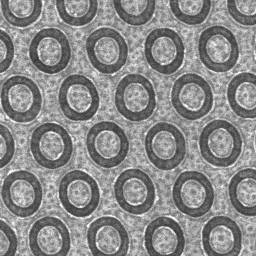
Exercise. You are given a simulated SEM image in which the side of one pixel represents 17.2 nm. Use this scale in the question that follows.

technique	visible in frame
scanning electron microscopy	a regular array of ring-shaped grooves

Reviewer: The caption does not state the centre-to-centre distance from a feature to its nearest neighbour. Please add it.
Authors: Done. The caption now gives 943 nm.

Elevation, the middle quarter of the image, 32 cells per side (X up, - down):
-XXXXXX--------XXXXXX--------XXX
XXXXXXXX------XXXXXXXX------XXXX
XX--XXXXXXX-XXXX---XXXXX---XXX--
------XXXXXXXXX------XXXXXXX----
-------XXXXXXX--------XXXXXX----
--XXX---XXXXX---XXXX--XXXXX---XX
-XXXXX--XXXXX--XXXXXX-XXXXX--XXX
-XXXXX---XXXX--XXXXXX--XXXX--XXX
-XXXXXX--XXXX--XXXXXX--XXXX--XXX
-XXXXXX--XXXX--XXXXXX--XXXX--XXX
--XXXX---XXXX---XXXXX--XXXX---XX
---XXX---XXXX---XXX----XXXXX----
--------XXXXXX--------XXXXXXX---
X------XXXXXXXX------XXXXXXXXX--
XXXXXXXXX---XXXXXXXXXXXX-XXXXXXX
XXXXXXX-------XXXXXXXX------XXXX
-XXXXX---------XXXXXX--------XXX
-XXXXX---XXXX--XXXXXX--XXXX---XX
--XXX---XXXXXX--XXXX--XXXXX---XX
--XXX---XXXXXX--XXXX--XXXXXX--XX
--XXXX--XXXXXX--XXXX--XXXXXX---X
--XXXX--XXXXXX--XXXX--XXXXXX---X
--XXXX---XXXX---XXXXX--XXXX----X
--XXXXX--------XXXXXX---XXX---XX
-XXXXXXX-------XXXXXX--------XXX
XXXXXXXXX----XXXXXXXXXX-----XXXX
XXX-XXXXXXXXXXXX---XXXXXX-XXXXXX
------XXXXXXXX-------XXXXXXXX---
-------XXXXXX--------XXXXXXX----
---XX---XXXXX--XXXX---XXXXXX---X
-XXXXX--XXXXX--XXXXX---XXXX---XX
-XXXXXX--XXXX--XXXXXX--XXXX--XXX